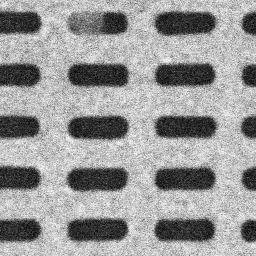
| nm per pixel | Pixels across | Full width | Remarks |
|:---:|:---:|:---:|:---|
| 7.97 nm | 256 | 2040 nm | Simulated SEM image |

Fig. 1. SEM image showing a regular array of holes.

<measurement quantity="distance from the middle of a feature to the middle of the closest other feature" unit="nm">412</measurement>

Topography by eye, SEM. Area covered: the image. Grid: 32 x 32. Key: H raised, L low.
HHHHHHHHHHHHHHHHHHHHHHHHHHHHHHHH
LLLLHHHHHLLLLLLHHHHHHLLLLLHHHHHH
LLLLLHHHLLLLLLLLHHHLLLLLLLLHHHLL
LLLLLHHHLLLLLLLLHHHLLLLLLLLHHHLL
HHHHHHHHHHHLLLHHHHHHHLLLHHHHHHHH
HHHHHHHHHHHHHHHHHHHHHHHHHHHHHHHH
HHHHHHHHHHHHHHHHHHHHHHHHHHHHHHHH
HHHHHHHHHHHHHHHHHHHHHHHHHHHHHHHH
LLLLLHHHHLLLLLLLHHHHLLLLLLLHHHHL
LLLLLHHHLLLLLLLLHHHLLLLLLLLHHHLL
LLLLLHHHHLLLLLLLHHHHLLLLLLHHHHHL
HHHHHHHHHHHHHHHHHHHHHHHHHHHHHHHH
HHHHHHHHHHHHHHHHHHHHHHHHHHHHHHHH
HHHHHHHHHHHHHHHHHHHHHHHHHHHHHHHH
LLLLHHHHHHLLLLLHHHHHLLLLLLHHHHHL
LLLLLHHHHLLLLLLLHHHLLLLLLLLHHHLL
LLLLLHHHLLLLLLLLHHHLLLLLLLLHHHLL
HHHHHHHHHHHHHHHHHHHHHHHHHHHHHHHH
HHHHHHHHHHHHHHHHHHHHHHHHHHHHHHHH
HHHHHHHHHHHHHHHHHHHHHHHHHHHHHHHH
HHHHHHHHHHHHHHHHHHHHHHHHHHHHHHHH
LLLLLHHHHLLLLLLLHHHLLLLLLLLHHHLL
LLLLLHHHLLLLLLLLHHHLLLLLLLLHHHLL
LLLLHHHHHLLLLLLLHHHHLLLLLLHHHHHL
HHHHHHHHHHHHHHHHHHHHHHHHHHHHHHHH
HHHHHHHHHHHHHHHHHHHHHHHHHHHHHHHH
HHHHHHHHHHHHHHHHHHHHHHHHHHHHHHHH
LLLLLHHHHLLLLLLLHHHHLLLLLLHHHHHL
LLLLLHHHLLLLLLLLHHHLLLLLLLLHHHLL
LLLLLHHHLLLLLLLLHHHLLLLLLLLHHHLL
HHHHHHHHHHHHHHHHHHHHHHHHHHHHHHHH
HHHHHHHHHHHHHHHHHHHHHHHHHHHHHHHH